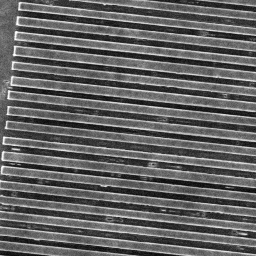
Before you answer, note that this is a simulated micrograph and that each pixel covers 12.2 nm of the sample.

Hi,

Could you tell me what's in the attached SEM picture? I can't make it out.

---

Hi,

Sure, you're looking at parallel lines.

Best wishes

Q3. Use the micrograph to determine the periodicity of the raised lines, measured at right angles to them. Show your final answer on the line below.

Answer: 15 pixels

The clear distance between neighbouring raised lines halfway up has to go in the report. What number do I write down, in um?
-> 0.0847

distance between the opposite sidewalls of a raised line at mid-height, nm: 96.8